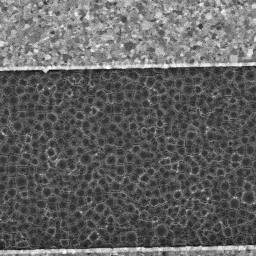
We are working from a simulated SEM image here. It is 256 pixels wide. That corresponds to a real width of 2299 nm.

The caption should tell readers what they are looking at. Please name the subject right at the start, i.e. one or a few lines or trenches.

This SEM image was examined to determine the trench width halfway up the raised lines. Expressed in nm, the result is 1650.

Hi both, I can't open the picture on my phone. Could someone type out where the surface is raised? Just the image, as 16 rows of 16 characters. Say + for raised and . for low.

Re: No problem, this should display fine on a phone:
++++++++++++++++
++++++++++++++++
++++++++++++++++
++++++++++++++++
................
................
................
................
................
................
................
................
................
................
................
.............+++